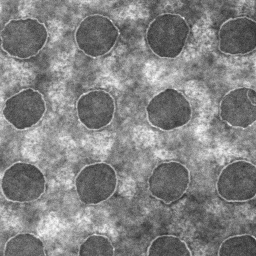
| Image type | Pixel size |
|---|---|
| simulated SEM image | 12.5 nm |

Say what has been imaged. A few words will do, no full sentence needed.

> a regular array of raised bodies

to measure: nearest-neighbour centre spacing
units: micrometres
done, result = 0.892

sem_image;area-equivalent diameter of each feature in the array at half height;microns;0.522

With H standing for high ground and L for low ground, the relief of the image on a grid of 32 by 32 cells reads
LLLLLLLLLLLLLLLLLLLLLLLLLLLLLLLL
LLLLLLLLLLLLLLLLLLLLLLLLLLLLLLLL
LLHHHLLLLLHHHHLLLLLHHHHLLLLLLHHL
HHHHHHLLLLHHHHHLLLLHHHHHLLLLHHHH
HHHHHHLLLHHHHHHLLLHHHHHLLLLHHHHH
HHHHHHLLLLHHHHLLLLLHHHHLLLLHHHHH
LHHHHLLLLLHHHHLLLLLHHHHLLLLLHHHL
LLLLLLLLLLLLLLLLLLLLLLLLLLLLLLLL
LLLLLLLLLLLLLLLLLLLLLLLLLLLLLLLL
LLLLLLLLLLLLLLLLLLLLLLLLLLLLLLLL
LLLLLLLLLLLLLLLLLLLLLLLLLLLLLLLL
LLHHHLLLLLLHHLLLLLLLHHLLLLLLLHHL
LHHHHHLLLLHHHHLLLLLHHHHLLLLLHHHL
HHHHHHLLLLHHHHLLLLHHHHHHLLLHHHHH
HHHHHLLLLLHHHHLLLLHHHHHHLLLLHHHH
LHHHLLLLLLHHHLLLLLLHHHHLLLLLLHHL
LLLLLLLLLLLLLLLLLLLLLLLLLLLLLLLL
LLLLLLLLLLLLLLLLLLLLLLLLLLLLLLLL
LLLLLLLLLLLLLLLLLLLLLLLLLLLLLLLL
LLLLLLLLLLLLLLLLLLLLLLLLLLLLLLLL
LLHHLLLLLLLLHLLLLLLLHHHLLLLLLHHH
LHHHHLLLLLHHHHLLLLLHHHHHLLLLHHHH
HHHHHHLLLHHHHHHLLLLHHHHHLLLHHHHH
HHHHHHLLLHHHHHLLLLLHHHHLLLLHHHHH
LHHHHLLLLLHHHHLLLLLHHHHLLLLLHHHH
LLLLLLLLLLLHLLLLLLLLLLLLLLLLLLLL
LLLLLLLLLLLLLLLLLLLLLLLLLLLLLLLL
LLLLLLLLLLLLLLLLLLLLLLLLLLLLLLLL
LLLLLLLLLLLLLLLLLLLLLLLLLLLLLLLL
LLHHLLLLLLLHHLLLLLLLHHLLLLLLLLHL
LHHHHLLLLLHHHHLLLLLHHHHLLLLLHHHH
LHHHHHLLLLHHHHLLLLHHHHHHLLLHHHHH